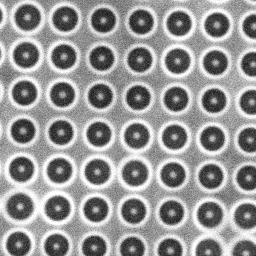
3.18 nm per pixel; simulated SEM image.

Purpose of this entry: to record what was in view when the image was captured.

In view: an array of small figures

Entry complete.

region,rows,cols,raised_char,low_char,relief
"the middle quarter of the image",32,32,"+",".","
..+++++.....++++......+++.......
.+++++++...++++++....+++++.....+
+++++++++++++++++++++++++++...++
++++++++++++++++++++++++++++++++
.+++++++++++++++++++++++++++++++
..+++++....++++++...++++++++.+++
...+++......++++.....+++++....++
...+++......+++.......+++......+
...+++......+++.......+++......+
..++++......+++.......+++......+
.++++++....+++++.....++++......+
+++++++++++++++++...++++++....++
++++++++++++++++++++++++++++++++
++++++++++++++++++++++++++++++++
.+++++++..++++++++++++++++++++++
..++++.....+++++.....+++++....++
...+++......+++......++++......+
...++.......+++...+...++.......+
..+++.......+++.......++...+...+
..++++......+++......+++.......+
+++++++....+++++.....++++.....++
+++++++++++++++++..+++++++...+++
++++++++++++++++++++++++++++++++
++++++++.+++++++++++++++++++++++
..++++.....++++.....++++++..++++
..+++.......+++......++++.....++
..+++...+...++.......+++......++
..+++...+...++........++.......+
..+++.......++.......+++......++
.+++++.....++++......+++......++
++++++++.+++++++....+++++....+++
++++++++++++++++++++++++++++++++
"